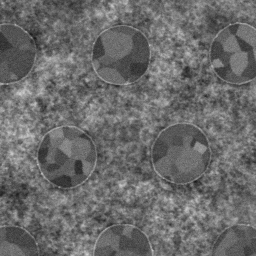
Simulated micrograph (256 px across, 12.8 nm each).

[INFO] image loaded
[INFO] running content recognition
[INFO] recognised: raised bodies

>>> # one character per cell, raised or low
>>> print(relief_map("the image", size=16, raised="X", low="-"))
----------------
----------------
XX----XXX----XXX
XX----XXX----XXX
XX----XXX----XXX
----------------
----------------
----------------
---XX-----XXX---
--XXXX---XXXX---
--XXXX----XXX---
---XX-----------
----------------
----------------
XX----XXX-----XX
XX----XXX----XXX